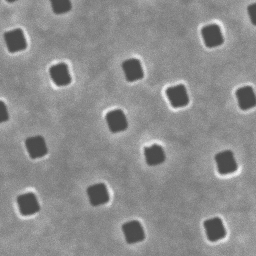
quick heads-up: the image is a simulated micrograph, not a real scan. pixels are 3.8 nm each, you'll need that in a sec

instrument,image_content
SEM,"a regular array of holes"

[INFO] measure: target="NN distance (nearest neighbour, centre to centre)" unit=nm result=214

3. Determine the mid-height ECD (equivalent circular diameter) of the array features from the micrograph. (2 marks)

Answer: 87.6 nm